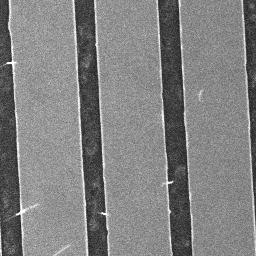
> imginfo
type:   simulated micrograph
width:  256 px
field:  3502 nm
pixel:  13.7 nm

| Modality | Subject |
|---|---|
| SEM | one or a few lines or trenches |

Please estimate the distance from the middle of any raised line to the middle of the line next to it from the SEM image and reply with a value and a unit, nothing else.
1160 nanometres